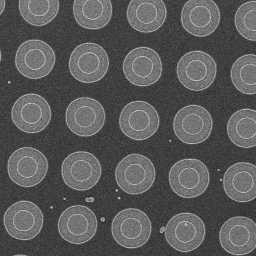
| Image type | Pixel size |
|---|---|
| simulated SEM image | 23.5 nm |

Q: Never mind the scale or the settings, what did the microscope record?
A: an array of small figures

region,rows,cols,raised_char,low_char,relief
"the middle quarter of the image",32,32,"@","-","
@---@@@@@--@@@@--@@@@@--@@@@@--@
@@--@@@@---@@@@--@@@@@--@@@@---@
@@--------@@@@@---@@@---@@@@---@
@@@------@@@@@@@--------@@@@@--@
@@@@@--@@@@@@@@@@-----@@@@@@@---
@@@@@@@@@@@@@@@@@@@@@@@@@@@@@@--
@@@@@@@@@@@@@@@@@@@@@@@@@@@@@@@@
@@@@@@@@@@@@@@@@@@@@@@@@@@@@@@@@
@@@@@-@@@@@@@@@@@@@@@@@@@@@@@@@@
@@------@@@@@@@@@@--@@@@@@@@@@@@
@--------@@@@@@@------@@@@@@@@@-
@---------@@@@@--------@@@@@@---
@---------@@@@---@@@@--@@@@@----
@---------@@@@--@@@@@---@@@@----
@---------@@@@--@@@@@---@@@@----
@--------@@@@@---@@@@--@@@@-----
@@-------@@@@@@---@@---@@@@@----
@@@----@@@@@@@@-------@@@@@@----
@@@@@@@@@@@@@@@@@---@@@@@@@@@---
@@@@@@@@@@@@@@@@@@@@@@@@@@@@@@--
@@@@@@@@@@@@@@@@@@@@@@@@@@@@@@@@
@@@@@@@@@@@@@@@@@@@@@@@@@@@@@@@@
@@----@@@@@@@@@@@@@@@@@@@@@@@@@@
@-------@@@@@@@------@@@@@@@@@@@
--------@@@@@@--------@@@@@@@---
---------@@@@---------@@@@@@----
---------@@@@----------@@@@---@@
---------@@@@----------@@@---@@@
---------@@@@----------@@@---@@@
--------@@@@@---------@@@@@--@@@
@------@@@@@@@--------@@@@@---@@
@@@@@@@@@@@@@@@------@@@@@@-----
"